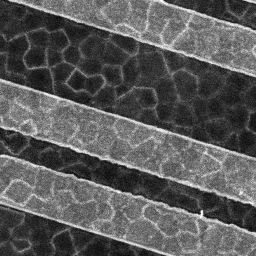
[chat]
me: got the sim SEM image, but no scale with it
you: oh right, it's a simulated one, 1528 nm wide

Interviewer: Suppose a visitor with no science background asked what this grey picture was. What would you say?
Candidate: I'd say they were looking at one or a few lines or trenches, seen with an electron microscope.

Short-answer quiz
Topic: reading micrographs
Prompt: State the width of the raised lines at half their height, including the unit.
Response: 259 nanometres